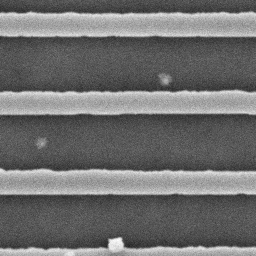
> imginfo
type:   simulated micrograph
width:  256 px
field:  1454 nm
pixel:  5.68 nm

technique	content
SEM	lines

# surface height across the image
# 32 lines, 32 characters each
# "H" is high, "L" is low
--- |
LLLLLLLLLLLLLLLLLLLLLLLLLLLLLLLL
LLLLLLLLLLLLLLLLLLLLLLLLLLLLLLLL
HHHHHHHHHHHHHHHHHHHHHHHHHHHHHHHH
HHHHHHHHHHHHHHHHHHHHHHHHHHHHHHHH
HHHHHHHHHHLHHHHHHHHLHHHHHHHHHHHH
LLLLLLLLLLLLLLLLLLLLLLLLLLLLLLLL
LLLLLLLLLLLLLLLLLLLLLLLLLLLLLLLL
LLLLLLLLLLLLLLLLLLLLLLLLLLLLLLLL
LLLLLLLLLLLLLLLLLLLLLLLLLLLLLLLL
LLLLLLLLLLLLLLLLLLLLLLLLLLLLLLLL
LLLLLLLLLLLLLLLLLLLLLLLLLLLLLLLL
HLLHHHHLLLLHHLLHHHHHHHHHHHHHHHHL
HHHHHHHHHHHHHHHHHHHHHHHHHHHHHHHH
HHHHHHHHHHHHHHHHHHHHHHHHHHHHHHHH
LLLLLLLLLLLLLLLLLLLLLLLLLLLLLLLL
LLLLLLLLLLLLLLLLLLLLLLLLLLLLLLLL
LLLLLLLLLLLLLLLLLLLLLLLLLLLLLLLL
LLLLLLLLLLLLLLLLLLLLLLLLLLLLLLLL
LLLLLLLLLLLLLLLLLLLLLLLLLLLLLLLL
LLLLLLLLLLLLLLLLLLLLLLLLLLLLLLLL
LLLLLLLLLLLLLLLLLLLLLLLLLLLLLLLL
HHHHHHHHHHHHHHHHHHHHHHHHHHHHHLHH
HHHHHHHHHHHHHHHHHHHHHHHHHHHHHHHH
HHHHHHHHHHHHHHHHHHHHHHHHHHHHHHHH
LLLLLLLLLLLLLLLLLLLLLLLLLLLLLLLL
LLLLLLLLLLLLLLLLLLLLLLLLLLLLLLLL
LLLLLLLLLLLLLLLLLLLLLLLLLLLLLLLL
LLLLLLLLLLLLLLLLLLLLLLLLLLLLLLLL
LLLLLLLLLLLLLLLLLLLLLLLLLLLLLLLL
LLLLLLLLLLLLLLLLLLLLLLLLLLLLLLLL
LLLLLLLLLLLLLLHLLLLLLLLLLLLLLLLL
HHHHHHHHHHHHHHHHHHHHHHHHHHHHHHHH